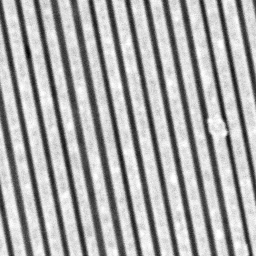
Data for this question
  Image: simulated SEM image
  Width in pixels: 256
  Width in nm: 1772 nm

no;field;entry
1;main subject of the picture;parallel lines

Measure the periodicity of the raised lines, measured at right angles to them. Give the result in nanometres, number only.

125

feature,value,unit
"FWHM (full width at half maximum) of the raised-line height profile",10.1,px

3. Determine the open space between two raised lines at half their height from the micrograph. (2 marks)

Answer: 52.7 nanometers